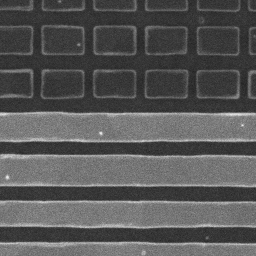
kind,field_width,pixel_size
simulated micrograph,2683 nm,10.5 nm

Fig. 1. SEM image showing wiring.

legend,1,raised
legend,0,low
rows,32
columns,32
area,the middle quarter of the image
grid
00000000000000000000000000000000
00000000000000000000000000000000
11111001111111111100111111111110
11111001111111111100111111111110
11111001111111111100111111111110
11111001111111111100111111111110
11111000111111111100111111111110
11111000111111111100111111111110
00000000000000000000000000000000
00000000000000000000000000000000
00000000000000000000000000000000
00000000000000000000000000000000
11100011111100111111111111111111
11111111111111111111111111111111
11111111111111111111111111111111
11111111111111111111111111111111
11111111111111111111111111111111
11111111111111111111111111111111
11111111111111111111111111111111
00000000000000000000000000000000
00000000000000000000000000000000
00000000000000000000000000000000
00000000000000000000000000000000
11111111111111111111111111111111
11111111111111111111111111111111
11111111111111111111111111111111
11111111111111111111111111111111
11111111111111111111111111111111
11111111111111111111111111111111
11111111111111111111111111111111
00000000000000000000000000000000
00000000000000000000000000000000